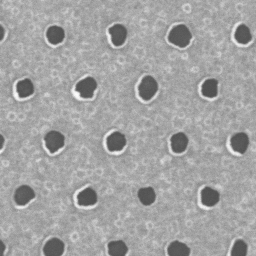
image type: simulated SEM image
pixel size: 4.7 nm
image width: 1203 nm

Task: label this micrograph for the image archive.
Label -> a regular array of holes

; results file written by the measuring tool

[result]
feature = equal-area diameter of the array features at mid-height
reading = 93.3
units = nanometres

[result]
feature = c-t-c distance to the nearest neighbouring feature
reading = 286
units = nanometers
